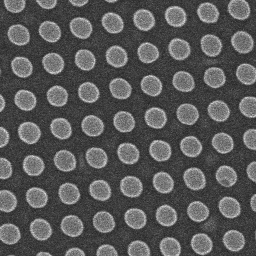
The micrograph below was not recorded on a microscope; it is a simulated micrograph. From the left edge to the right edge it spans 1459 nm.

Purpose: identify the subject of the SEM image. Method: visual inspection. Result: a regular array of raised bodies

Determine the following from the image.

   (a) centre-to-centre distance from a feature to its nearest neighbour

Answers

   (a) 179 nanometers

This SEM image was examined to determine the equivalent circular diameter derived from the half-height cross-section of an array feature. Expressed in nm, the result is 116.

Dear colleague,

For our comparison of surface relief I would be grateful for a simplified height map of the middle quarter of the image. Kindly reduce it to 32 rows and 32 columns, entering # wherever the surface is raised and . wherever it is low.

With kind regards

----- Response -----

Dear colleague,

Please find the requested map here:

....###......#..................
................................
............................###.
....................###....#####
............####....####...#####
....####....####...#####....####
....####....#####...####.....###
#...#####...####.....###........
#...####.....##.................
................................
.............................###
.....................###....####
.............###....#####...####
......##.....####....####....###
#....####....####....####....###
#....#####...####.....###.......
##...#####....###...............
##....###.......................
#.............................##
......................###....###
..............###.....####...###
......####...#####....#####...##
##....####....#####...####....##
###...#####...####.....###......
###...#####....###..............
###....###......................
##.............................#
.......................###....##
...............###.....####...##
........##....#####...#####...##
###....####...#####....####....#
####...####...#####....####.....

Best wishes